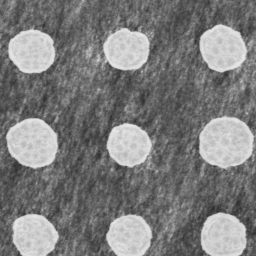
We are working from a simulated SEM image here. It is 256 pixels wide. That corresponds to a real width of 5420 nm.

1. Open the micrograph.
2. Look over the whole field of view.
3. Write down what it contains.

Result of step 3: raised bodies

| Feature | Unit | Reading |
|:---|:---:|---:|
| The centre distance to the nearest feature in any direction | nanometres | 1990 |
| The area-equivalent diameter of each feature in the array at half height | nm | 907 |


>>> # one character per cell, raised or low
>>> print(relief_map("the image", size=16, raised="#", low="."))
................
................
.##....##....##.
.##....##....##.
................
................
................
..............#.
.##....##....###
.##....##....###
................
................
................
................
.##....##....##.
.##....##....##.